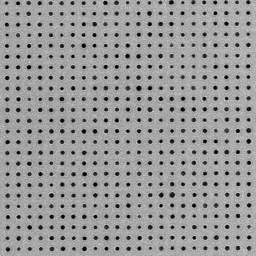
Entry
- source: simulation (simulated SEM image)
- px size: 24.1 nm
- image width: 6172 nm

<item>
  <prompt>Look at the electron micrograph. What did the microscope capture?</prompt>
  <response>a regular array of holes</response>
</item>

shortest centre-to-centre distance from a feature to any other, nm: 252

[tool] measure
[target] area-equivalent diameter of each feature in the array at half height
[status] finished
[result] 0.109 micrometres